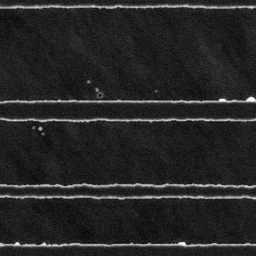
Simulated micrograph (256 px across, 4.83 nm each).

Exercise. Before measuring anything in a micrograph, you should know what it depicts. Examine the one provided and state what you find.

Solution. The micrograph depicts lines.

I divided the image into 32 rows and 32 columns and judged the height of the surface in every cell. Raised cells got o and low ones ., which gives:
oooooooooooooooooooooooooooooooo
................................
................................
................................
................................
................................
................................
................................
................................
................................
................................
................................
...............................o
oooooooooooooooooooooooooooooooo
oooooooooooooooooooooooooooooooo
................................
................................
................................
................................
................................
................................
................................
................................
oooooooooooooooooooooooooooooooo
oooooooooooooooooooooooooooooooo
................................
................................
................................
................................
................................
........oo......o.o...o...o...oo
oooooooooooooooooooooooooooooooo